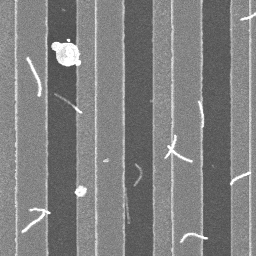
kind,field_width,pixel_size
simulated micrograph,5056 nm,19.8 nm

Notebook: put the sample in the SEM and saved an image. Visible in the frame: lines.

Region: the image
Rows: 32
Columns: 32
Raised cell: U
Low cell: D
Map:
UUUUUUDDDDUUUUUUDDDUUUUUUDDDDUUU
UUUUUUDDDDUUUUUUDDDUUUUUUDDDDUUU
UUUUUUDDDDUUUUUDDDDUUUUUUDDDDUUU
UUUUUUDDDDUUUUUDDDDUUUUUUDDDDUUU
UUUUUUDDDDUUUUUUDDDUUUUUUDDDDUUU
UUUUUUDUUUUUUUUUDDDUUUUUUDDDDUUU
UUUUUUDUUUUUUUUUDDDUUUUUUDDDDUUU
UUUUUUDUUUUUUUUUDDDUUUUUUDDDDUUU
UUUUUUDDDDUUUUUUDDDUUUUUUDDDDUUU
UUUUUUDDDDUUUUUUDDDUUUUUUDDDDUUU
UUUUUUDDDDUUUUUUDDDUUUUUUDDDDUUU
UUUUUUDDDDUUUUUUDDDUUUUUUDDDDUUU
UUUUUUDDDDUUUUUUDDDUUUUUUDDDDUUU
UUUUUUDDDDUUUUUUDDDUUUUUUDDDDUUU
UUUUUUDDDDUUUUUUDDDUUUUUUDDDDUUU
UUUUUUDDDDUUUUUUDDDUUUUUUDDDDUUU
UUUUUUDDDDUUUUUUDDDUUUUUUDDDDUUU
UUUUUUDDDDUUUUUUDDDUUUUUUDDDDUUU
UUUUUUDDDDUUUUUUDDDUUUUUUDDDDUUU
UUUUUUDDDDUUUUUUDDDUUUUUUDDDDUUU
UUUUUUDDDDUUUUUUDDDUUUUUUDDDDUUU
UUUUUUDDDDUUUUUUDDDUUUUUUDDDDUUU
UUUUUUDDDDUUUUUUDDDUUUUUUDDDDUUU
UUUUUUDDDDUUUUUUDDDUUUUUUDDDDUUU
UUUUUUDDDDUUUUUUDDDUUUUUUDDDDUUU
UUUUUUDDDDUUUUUUDDDUUUUUUDDDDUUU
UUUUUUDDDDUUUUUUDDDUUUUUUDDDDUUU
UUUUUUDDDDUUUUUUDDDUUUUUUDDDDUUU
UUUUUUDDDDUUUUUUDDDUUUUUUDDDDUUU
UUUUUUDDDDUUUUUUDDDUUUUUUUDDDUUU
UUUUUUDDDDUUUUUUDDDUUUUUUDDDDUUU
UUUUUUDDDDUUUUUUDDDUUUUUUDDDDUUU